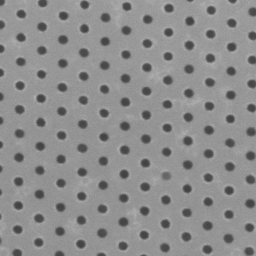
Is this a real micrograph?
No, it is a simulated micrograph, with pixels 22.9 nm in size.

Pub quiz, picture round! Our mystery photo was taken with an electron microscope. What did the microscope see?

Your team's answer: a regular array of holes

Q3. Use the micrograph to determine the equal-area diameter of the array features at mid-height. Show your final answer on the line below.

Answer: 221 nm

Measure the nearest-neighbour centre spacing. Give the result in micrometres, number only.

0.545